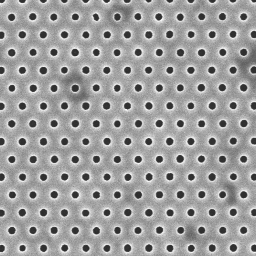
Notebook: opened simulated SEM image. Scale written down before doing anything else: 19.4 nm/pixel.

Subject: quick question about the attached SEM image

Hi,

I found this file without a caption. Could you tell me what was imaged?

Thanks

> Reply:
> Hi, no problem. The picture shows a regular array of holes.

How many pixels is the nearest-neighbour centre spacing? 20.3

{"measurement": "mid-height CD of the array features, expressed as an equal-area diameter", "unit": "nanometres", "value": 144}